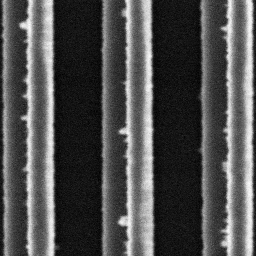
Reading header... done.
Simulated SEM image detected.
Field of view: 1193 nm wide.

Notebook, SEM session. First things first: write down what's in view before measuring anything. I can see lines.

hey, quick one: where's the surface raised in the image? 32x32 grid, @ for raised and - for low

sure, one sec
@@@@@@@------@@@@@@------@@@@@@@
@@@@@@@------@@@@@@------@@@@@@@
@@@@@@@------@@@@@@------@@@@@@@
@@@@@@@------@@@@@@------@@@@@@@
@@@@@@@------@@@@@@------@@@@@@-
@@@@@@@------@@@@@@------@@@@@@@
@@@@@@@------@@@@@@------@@@@@@@
@@@@@@@------@@@@@@------@@@@@@@
@@@@@@@------@@@@@@------@@@@@@@
@@@@@@@------@@@@@@------@@@@@@@
@@@@@@@------@@@@@@------@@@@@@@
@@@@@@@------@@@@@@------@@@@@@@
@@@@@@@------@@@@@@------@@@@@@@
-@@@@@@------@@@@@@------@@@@@@@
@@@@@@@------@@@@@@------@@@@@@@
@@@@@@@------@@@@@@------@@@@@@-
-@@@@@@------@@@@@@------@@@@@@@
-@@@@@@------@@@@@@------@@@@@@-
-@@@@@@------@@@@@@------@@@@@@@
-@@@@@@------@@@@@@------@@@@@@@
-@@@@@@------@@@@@@------@@@@@@@
-@@@@@@------@@@@@@------@@@@@@@
-@@@@@@------@@@@@@------@@@@@@-
-@@@@@@------@@@@@@------@@@@@@@
-@@@@@@------@@@@@@------@@@@@@@
-@@@@@@------@@@@@@------@@@@@@@
-@@@@@@------@@@@@@------@@@@@@@
-@@@@@@------@@@@@@------@@@@@@@
-@@@@@@------@@@@@@------@@@@@@@
-@@@@@@------@@@@@@------@@@@@@@
-@@@@@@------@@@@@@------@@@@@@@
-@@@@@@------@@@@@@------@@@@@@-